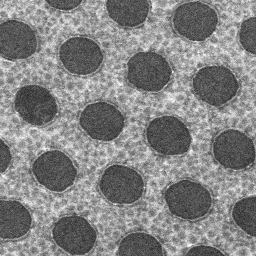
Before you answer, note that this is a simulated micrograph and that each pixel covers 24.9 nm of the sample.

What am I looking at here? a regular array of raised bodies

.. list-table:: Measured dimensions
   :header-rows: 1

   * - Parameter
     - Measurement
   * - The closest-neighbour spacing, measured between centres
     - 1660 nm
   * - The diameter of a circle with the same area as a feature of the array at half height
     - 1.07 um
